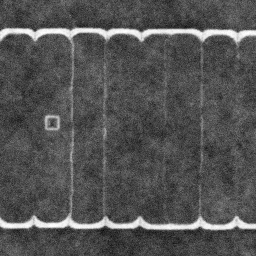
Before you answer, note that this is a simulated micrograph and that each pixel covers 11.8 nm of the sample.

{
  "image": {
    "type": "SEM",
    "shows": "wiring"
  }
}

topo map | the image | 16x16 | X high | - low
----------------
----------------
XXXXXXXXXXXXXXXX
XXXXXXXXXXXXXXXX
XXXXXXXXXXXXXXXX
XXXXXXXXXXXXXXXX
XXXXXXXXXXXXXXXX
XXXXXXXXXXXXXXXX
XXXXXXXXXXXXXXXX
XXXXXXXXXXXXXXXX
XXXXXXXXXXXXXXXX
XXXXXXXXXXXXXXXX
XXXXXXXXXXXXXXXX
XXXXXXXXXXXXXXXX
----------------
----------------